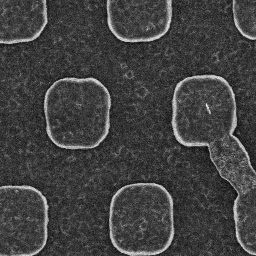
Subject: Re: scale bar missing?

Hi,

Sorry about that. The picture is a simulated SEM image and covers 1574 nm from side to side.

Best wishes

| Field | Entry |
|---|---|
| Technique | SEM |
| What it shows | raised bodies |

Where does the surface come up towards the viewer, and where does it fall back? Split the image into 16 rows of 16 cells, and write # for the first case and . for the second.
###....####....#
###....####....#
##......#.......
................
................
...####....###..
...####....####.
...####....####.
...####....####.
.............##.
..............##
..............##
###....####....#
###....####....#
###....####....#
###....###.....#